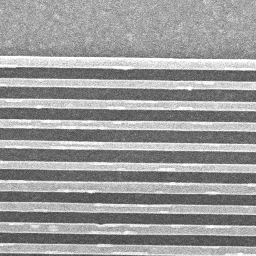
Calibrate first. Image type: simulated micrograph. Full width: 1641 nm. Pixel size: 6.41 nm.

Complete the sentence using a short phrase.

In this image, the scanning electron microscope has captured parallel lines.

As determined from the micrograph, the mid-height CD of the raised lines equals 56.1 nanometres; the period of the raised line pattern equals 133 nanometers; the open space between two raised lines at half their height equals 12.3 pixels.